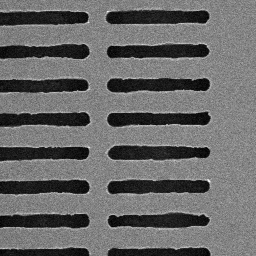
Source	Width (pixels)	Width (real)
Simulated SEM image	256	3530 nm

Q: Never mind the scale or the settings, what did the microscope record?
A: holes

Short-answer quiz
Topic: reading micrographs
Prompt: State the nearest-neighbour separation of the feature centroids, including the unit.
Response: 467 nanometers